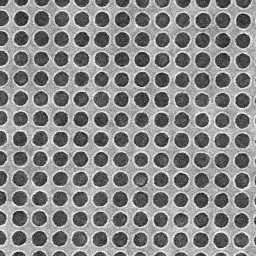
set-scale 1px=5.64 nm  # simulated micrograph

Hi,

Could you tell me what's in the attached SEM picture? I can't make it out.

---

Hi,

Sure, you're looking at a regular array of holes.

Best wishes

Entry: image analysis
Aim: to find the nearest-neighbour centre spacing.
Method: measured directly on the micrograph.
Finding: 112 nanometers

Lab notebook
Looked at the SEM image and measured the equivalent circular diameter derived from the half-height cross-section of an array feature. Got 15.7 px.